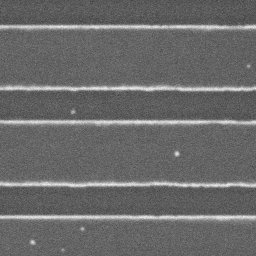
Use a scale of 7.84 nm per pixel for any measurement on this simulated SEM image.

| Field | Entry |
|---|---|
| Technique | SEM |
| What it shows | lines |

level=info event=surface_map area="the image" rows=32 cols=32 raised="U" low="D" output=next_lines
DDDDDDDDDDDDDDDDDDDDDDDDDDDDDDDD
DDDDDDDDDDDDDDDDDDDDDDDDDDDDDDDD
DDDDDDDDDDDDDDDDDDDDDDDDDDDDDDDD
UUUUUUUUUUUUUUUUUUUUUUUUUUUUUUUU
UUUUUUUUUUUUUUUUUUUUUUUUUUUUUUUU
UUUUUUUUUUUUUUUUUUUUUUUUUUUUUUUU
UUUUUUUUUUUUUUUUUUUUUUUUUUUUUUUU
UUUUUUUUUUUUUUUUUUUUUUUUUUUUUUUU
UUUUUUUUUUUUUUUUUUUUUUUUUUUUUUUU
UUUUUUUUUUUUUUUUUUUUUUUUUUUUUUUU
UUUUUUUUUUUUUUUUUUUUUUUUUUUUUUUU
DDDDDDDDDDDDDDDDDDDDDDDDDDDDDDDD
DDDDDDDDDDDDDDDDDDDDDDDDDDDDDDDD
DDDDDDDDDDDDDDDDDDDDDDDDDDDDDDDD
DDDDDDDDDDDDDDDDDDDDDDDDDDDDDDDD
UUUUUUUUUUUUUUUUUUUUUUUUUUUUUUUU
UUUUUUUUUUUUUUUUUUUUUUUUUUUUUUUU
UUUUUUUUUUUUUUUUUUUUUUUUUUUUUUUU
UUUUUUUUUUUUUUUUUUUUUUUUUUUUUUUU
UUUUUUUUUUUUUUUUUUUUUUUUUUUUUUUU
UUUUUUUUUUUUUUUUUUUUUUUUUUUUUUUU
UUUUUUUUUUUUUUUUUUUUUUUUUUUUUUUU
UUUUUUUUUUUUUUUUUUUUUUUUUUUUUUUU
DDDDDDDDDDDDDDDDDDDDDDDDDDDDDDDD
DDDDDDDDDDDDDDDDDDDDDDDDDDDDDDDD
DDDDDDDDDDDDDDDDDDDDDDDDDDDDDDDD
DDDDDDDDDDDDDDDDDDDDDDDDDDDDDDDD
UUUUUUUUUUUUUUUUUUUUUUUUUUUUUUUU
UUUUUUUUUUUUUUUUUUUUUUUUUUUUUUUU
UUUUUUUUUUUUUUUUUUUUUUUUUUUUUUUU
UUUUUUUUUUUUUUUUUUUUUUUUUUUUUUUU
UUUUUUUUUUUUUUUUUUUUUUUUUUUUUUUU